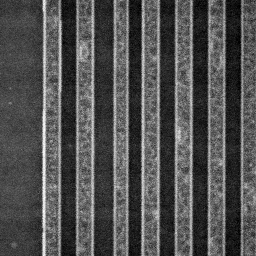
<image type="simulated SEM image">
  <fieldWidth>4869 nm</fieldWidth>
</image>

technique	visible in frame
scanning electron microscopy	parallel lines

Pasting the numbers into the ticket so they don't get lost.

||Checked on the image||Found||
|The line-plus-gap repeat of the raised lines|0.625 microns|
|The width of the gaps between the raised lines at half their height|335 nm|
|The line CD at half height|283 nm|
